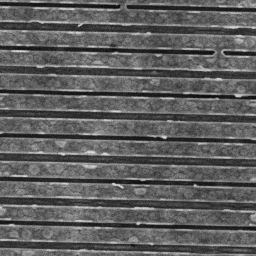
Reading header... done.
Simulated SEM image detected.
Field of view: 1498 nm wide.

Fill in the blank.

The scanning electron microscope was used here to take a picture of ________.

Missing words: parallel lines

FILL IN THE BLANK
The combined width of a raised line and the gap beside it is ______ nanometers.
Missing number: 128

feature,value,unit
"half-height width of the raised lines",95.1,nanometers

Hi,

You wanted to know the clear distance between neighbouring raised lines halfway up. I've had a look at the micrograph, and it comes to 0.0369 um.